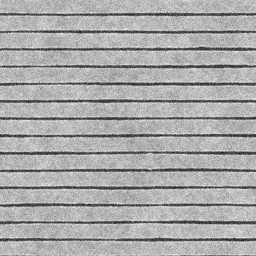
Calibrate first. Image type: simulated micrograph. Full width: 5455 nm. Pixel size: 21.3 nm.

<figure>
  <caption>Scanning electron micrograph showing parallel lines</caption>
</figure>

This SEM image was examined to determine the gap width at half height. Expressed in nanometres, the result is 71.9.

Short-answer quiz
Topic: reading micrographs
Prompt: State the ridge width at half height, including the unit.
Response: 298 nanometres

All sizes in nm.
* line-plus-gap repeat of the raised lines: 369